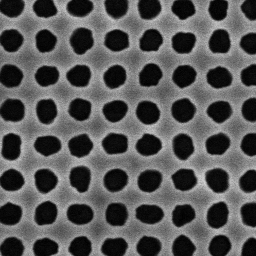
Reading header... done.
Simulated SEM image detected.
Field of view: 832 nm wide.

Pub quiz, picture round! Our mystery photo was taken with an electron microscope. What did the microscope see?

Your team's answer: a regular array of holes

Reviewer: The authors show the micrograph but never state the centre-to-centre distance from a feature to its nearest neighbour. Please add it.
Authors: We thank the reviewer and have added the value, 107 nm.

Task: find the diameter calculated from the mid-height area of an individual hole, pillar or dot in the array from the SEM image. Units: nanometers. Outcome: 75.7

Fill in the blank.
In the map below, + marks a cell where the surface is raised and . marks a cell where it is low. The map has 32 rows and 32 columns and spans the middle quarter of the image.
+++..+++++++..++++++...++++++..+
+......++++....+++++....++++....
+......+++.....++++......++.....
+.....++++......+++.....+++.....
+.....++++.....++++.....+++.....
+++..++++++...++++++.+++++++...+
++++++++++++++++++++++++++++++++
++++++++++++++++++++++++++++++++
++++++++++++++++++++++++++++++++
++....+++++....++++...++++++....
+......+++......++.....++++.....
+......+++......++......+++.....
+......+++.....+++......+++.....
++....+++++....++++.....+++.....
+++++++++++..++++++....++++++..+
++++++++++++++++++++++++++++++++
++++++++++++++++++++++++++++++++
+++++++++++...++++++..+++++++.++
++....++++......+++....+++++....
+......++.......++......+++.....
+......+++......++.......++.....
+......+++......++......+++.....
++....+++++..++++++....+++++....
+++++++++++++++++++++++++++++..+
++++++++++++++++++++++++++++++++
++++++++++++++++++++++++++++++++
++....++++++...++++++++++++++...
+......++++.....+++.....+++.....
+......+++......+++......++.....
+......+++......++......+++.....
++....++++.....+++......++++....
+++...+++++...+++++....++++++..+